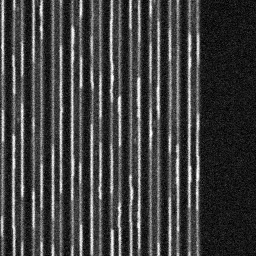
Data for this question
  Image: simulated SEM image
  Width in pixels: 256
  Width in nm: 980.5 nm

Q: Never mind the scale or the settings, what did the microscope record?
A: parallel lines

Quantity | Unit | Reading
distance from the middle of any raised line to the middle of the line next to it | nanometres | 74.6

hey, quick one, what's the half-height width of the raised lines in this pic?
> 50.7 nm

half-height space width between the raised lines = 23.4 nm